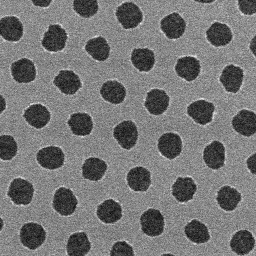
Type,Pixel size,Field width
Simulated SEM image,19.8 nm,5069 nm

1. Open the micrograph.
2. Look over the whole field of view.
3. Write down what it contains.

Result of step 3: a regular array of raised bodies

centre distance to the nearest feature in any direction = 886 nanometres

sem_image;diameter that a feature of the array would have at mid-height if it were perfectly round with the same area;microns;0.531